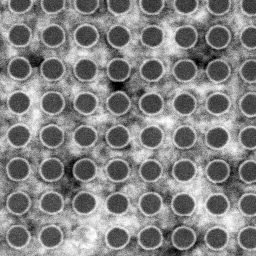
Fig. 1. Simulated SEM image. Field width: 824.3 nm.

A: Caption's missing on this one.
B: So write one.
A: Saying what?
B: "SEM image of a regular array of raised bodies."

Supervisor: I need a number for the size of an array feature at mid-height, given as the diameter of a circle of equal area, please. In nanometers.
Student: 75.7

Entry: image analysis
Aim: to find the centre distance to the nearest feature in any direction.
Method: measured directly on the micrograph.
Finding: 106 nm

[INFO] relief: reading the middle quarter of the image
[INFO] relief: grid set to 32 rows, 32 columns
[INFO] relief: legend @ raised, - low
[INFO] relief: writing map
---@@@@@---@@@@@@--@@@@@@---@@@@
---@@@@@---@@@@@@--@@@@@@--@@@@@
---@@@@@---@@@@@---@@@@@@--@@@@@
---@@@@@---@@@@@----@@@@----@@@@
--------------------------------
--------------------------------
--------------------------------
----@@@-----@@@------@@-----@@@-
---@@@@@---@@@@@---@@@@@@---@@@@
---@@@@@---@@@@@@--@@@@@@--@@@@@
---@@@@@---@@@@@@--@@@@@@--@@@@@
---@@@@@---@@@@@---@@@@@----@@@@
-----@-------@------@@@------@@@
--------------------------------
--------------------------------
----@@-------@--------@-------@-
---@@@@@---@@@@@----@@@@----@@@@
--@@@@@@---@@@@@---@@@@@@--@@@@@
--@@@@@@---@@@@@---@@@@@@--@@@@@
---@@@@@---@@@@@---@@@@@---@@@@@
----@@@-----@@@-----@@@-----@@@@
--------------------------------
--------------------------------
--------------------------------
---@@@@-----@@@-----@@@-----@@@@
---@@@@@---@@@@@---@@@@@---@@@@@
--@@@@@@---@@@@@---@@@@@@--@@@@@
--@@@@@@---@@@@@---@@@@@---@@@@@
---@@@@@---@@@@@---@@@@@----@@@@
--------------------------------
--------------------------------
--------------------------------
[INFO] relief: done